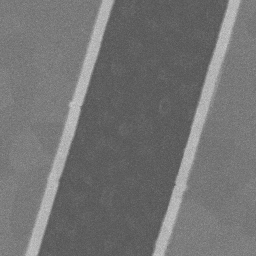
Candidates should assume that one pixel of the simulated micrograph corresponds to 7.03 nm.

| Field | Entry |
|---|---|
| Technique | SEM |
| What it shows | one or a few lines or trenches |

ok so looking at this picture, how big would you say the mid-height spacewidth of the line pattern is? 851 nm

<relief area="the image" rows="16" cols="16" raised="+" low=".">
+++++++........+
++++++........++
++++++........++
++++++........++
+++++........+++
+++++........+++
+++++........+++
+++++.......++++
++++........++++
++++........++++
++++........++++
+++........+++++
+++........+++++
+++........+++++
++........++++++
++........++++++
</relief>